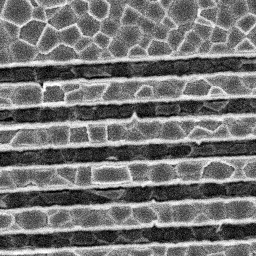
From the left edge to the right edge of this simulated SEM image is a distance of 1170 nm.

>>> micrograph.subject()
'parallel lines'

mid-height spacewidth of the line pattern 82.2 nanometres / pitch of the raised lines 191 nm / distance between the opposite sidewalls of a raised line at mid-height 0.107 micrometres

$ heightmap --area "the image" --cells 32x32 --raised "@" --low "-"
@@@@@@@@@@@@@@@@@@@@@@@@@@@@@@@@
@@@@@@@@@@@@@@@@@@@@@@@@@@@@@@@@
@@@@@@@@@@@@@@@@@@@@@@@@@@@@@@@@
@@@@@@@@@@@@@@@@@@@@@@@@@@@@@@@@
@@@@@@@@@@@@@@@@@@@@@@@@@@@@@@@@
@@@@@@@@@@@@@@@@@@@@@@@@@@@@@@@@
@@@@@@@@@@@@@@@@@@@@@@@@@@@@@@@@
@@@@@@@@@@@@@@@@@@--------------
--------------------------------
------------------------@@@@@@@@
@-@@@-@@@@@@@@@@@@@@@@@@@@@@@@@@
@@@@@@@@@@@@@@@@@@@@@@@@@@@@@@@@
@@@@@@@@@@@@@@@@@@@@@-----------
@-------------------------------
----------------------------@@@@
------@@@@@@@@@@@@@@@@@@@@@@@@@@
@@@@@@@@@@@@@@@@@@@@@@@@@@@@@@@@
@@@@@@@@@@@@@@@@@@@@@@@@@@@@----
@@@@@---------------------------
--------------------------------
-----------@@@@@@@@@@@@@@@@@@@@@
@@@@@@@@@@@@@@@@@@@@@@@@@@@@@@@@
@@@@@@@@@@@@@@@@@@@@@@@@@@@@@@--
@@@@@@@@@@@---------------------
--------------------------------
-----------------@@@@@@@@@@@@@@@
@@@@@@@@@@@@@@@@@@@@@@@@@@@@@@@@
@@@@@@@@@@@@@@@@@@@@@@@@@@@@@@@@
@@@@@@@@@@@@@@@@----------------
--------------------------------
-------------------@--@@@@@@@@@@
@@@@@@@@@@@@@@@@@@@@@@@@@@@@@@@@